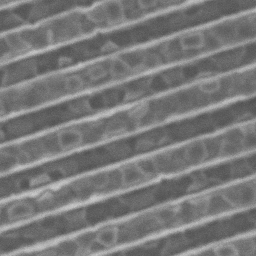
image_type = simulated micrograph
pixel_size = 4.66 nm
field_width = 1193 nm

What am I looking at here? parallel lines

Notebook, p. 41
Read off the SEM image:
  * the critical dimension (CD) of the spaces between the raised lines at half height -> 23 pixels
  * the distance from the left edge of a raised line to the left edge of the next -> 245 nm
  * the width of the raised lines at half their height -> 139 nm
